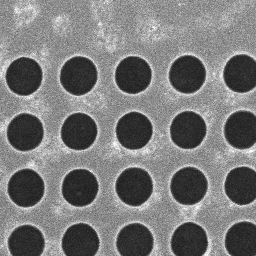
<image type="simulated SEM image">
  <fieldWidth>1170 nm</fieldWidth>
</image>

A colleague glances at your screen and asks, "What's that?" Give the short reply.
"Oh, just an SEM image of a regular array of holes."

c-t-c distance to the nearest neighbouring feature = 248 nm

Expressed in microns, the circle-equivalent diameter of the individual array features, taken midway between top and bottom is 0.169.